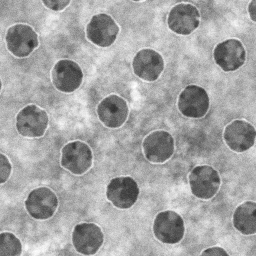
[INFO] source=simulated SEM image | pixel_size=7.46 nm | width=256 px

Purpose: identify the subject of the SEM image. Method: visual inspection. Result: a regular array of raised bodies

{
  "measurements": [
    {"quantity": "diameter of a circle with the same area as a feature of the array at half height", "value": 257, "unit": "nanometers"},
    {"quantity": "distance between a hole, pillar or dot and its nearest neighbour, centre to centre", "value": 430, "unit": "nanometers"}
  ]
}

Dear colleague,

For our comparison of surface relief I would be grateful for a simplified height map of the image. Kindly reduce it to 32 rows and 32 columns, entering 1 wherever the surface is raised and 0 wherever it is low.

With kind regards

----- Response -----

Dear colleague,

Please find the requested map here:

00000111100000000000001100000001
00000000000000000000011110000001
00000010000111000000011110000001
01110000000111100000011110000000
01111000000111100000000000000000
01111000000011000000000000011100
01110000000000000111000000011110
00000001100000000111100000011110
00000001110100000111100000011100
00000011110000000111000000000000
00000001110000000000000000000000
00000000100000000000000111000000
00000000001001110000001111000000
00011000000011110000001111000000
00111100000011110000000111000000
00111100000001100000000000000110
00111100000000000001100000001111
00000000000000000011110000001111
00000000111000000011110000000110
10000000111100000011110000000000
10000000111100000000000000000000
10000000011000000000000011100000
10000000000000111000000111110000
00001100000001111000000011100000
00011110000001111000000011100000
00011110000000111000000000000011
00011110000000000000110000000111
00000100000000000001111000000111
00000000011110000001111000000111
11000000011110000001111000000000
11100000011110000000010000000000
11100000001100000000000001110000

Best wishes